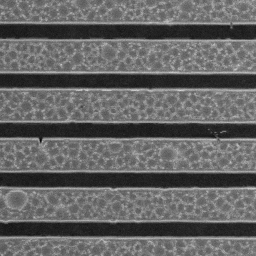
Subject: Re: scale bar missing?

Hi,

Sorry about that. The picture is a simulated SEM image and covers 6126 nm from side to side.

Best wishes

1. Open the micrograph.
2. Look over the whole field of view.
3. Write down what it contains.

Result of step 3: parallel lines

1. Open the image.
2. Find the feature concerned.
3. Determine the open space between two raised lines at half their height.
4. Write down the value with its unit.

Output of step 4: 0.38 micrometres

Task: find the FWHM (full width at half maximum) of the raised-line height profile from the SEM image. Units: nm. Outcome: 808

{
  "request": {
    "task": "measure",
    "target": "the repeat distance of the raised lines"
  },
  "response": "1180 nm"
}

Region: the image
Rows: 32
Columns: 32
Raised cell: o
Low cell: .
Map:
oooooooooooooooooooooooooooooooo
oooooooooooooooooooooooooooooooo
oooooooooooooooooooooooooooooooo
................................
................................
oooooooooooooooooooooooooooooooo
oooooooooooooooooooooooooooooooo
oooooooooooooooooooooooooooooooo
oooooooooooooooooooooooooooooooo
................................
................................
oooooooooooooooooooooooooooooooo
oooooooooooooooooooooooooooooooo
oooooooooooooooooooooooooooooooo
oooooooooooooooooooooooooooooooo
................................
................................
oooooooooooooooooooooooooooooooo
oooooooooooooooooooooooooooooooo
oooooooooooooooooooooooooooooooo
oooooooooooooooooooooooooooooooo
.....................ooooooooooo
................................
oo.o..ooo....o...oo.....oooo....
oooooooooooooooooooooooooooooooo
oooooooooooooooooooooooooooooooo
oooooooooooooooooooooooooooooooo
oooooooooooooooooooooooooooooooo
................................
................................
oooooooooooooooooooooooooooooooo
oooooooooooooooooooooooooooooooo